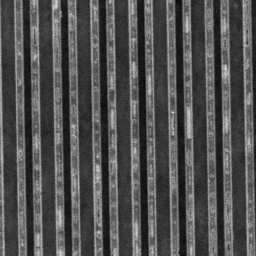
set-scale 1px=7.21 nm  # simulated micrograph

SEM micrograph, parallel lines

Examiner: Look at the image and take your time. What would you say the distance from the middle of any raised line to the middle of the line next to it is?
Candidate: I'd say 0.137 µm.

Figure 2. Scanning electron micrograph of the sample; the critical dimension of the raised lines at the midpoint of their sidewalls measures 55.9 nm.